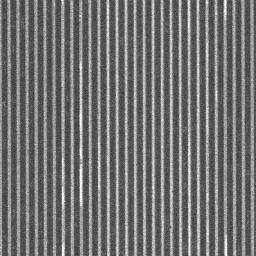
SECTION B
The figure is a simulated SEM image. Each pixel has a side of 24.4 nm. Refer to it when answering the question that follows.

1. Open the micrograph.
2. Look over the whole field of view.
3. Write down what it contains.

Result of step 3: parallel lines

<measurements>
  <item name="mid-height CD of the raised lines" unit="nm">48.7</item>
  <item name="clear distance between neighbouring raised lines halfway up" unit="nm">170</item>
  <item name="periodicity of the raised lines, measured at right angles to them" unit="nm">219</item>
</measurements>